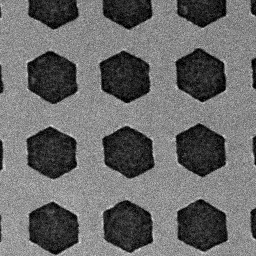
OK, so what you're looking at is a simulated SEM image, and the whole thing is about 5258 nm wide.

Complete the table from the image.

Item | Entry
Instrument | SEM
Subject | a regular array of holes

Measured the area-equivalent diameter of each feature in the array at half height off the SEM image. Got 1040 nm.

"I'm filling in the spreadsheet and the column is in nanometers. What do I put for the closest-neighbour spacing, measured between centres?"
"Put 1510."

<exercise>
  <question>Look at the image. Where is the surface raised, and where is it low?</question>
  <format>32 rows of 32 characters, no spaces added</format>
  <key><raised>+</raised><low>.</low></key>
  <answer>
++++......+++......+++......+++.
++++......+++......+++......+++.
+++++....+++++....+++++....+++++
++++++.+++++++++.+++++++++++++++
++++++++++++++++++++++++++++++++
++++++++++++++++++++++++++++++++
++++++.++++++++.++++++++..++++++
++++.....++++.....++++.....+++++
+++.......++.......+++......+++.
+++.......+++......+++......++++
+++.......+++......+++......++++
++++......+++......++++.....++++
++++++..+++++++..++++++++.++++++
++++++++++++++++++++++++++++++++
++++++++++++++++++++++++++++++++
++++++++++++++++++++++++++++++++
+++++...++++++...++++++....+++++
+++......++++......+++......++++
+++.......+++......+++......++++
+++.......+++......+++......++++
+++.......+++......++++.....++++
+++++....++++++...++++++...+++++
++++++++++++++++++++++++++++++++
++++++++++++++++++++++++++++++++
++++++++++++++++++++++++++++++++
++++++.++++++++..+++++++..++++++
++++.....++++......+++......+++.
++++......+++......+++......+++.
++++......+++......+++......+++.
++++......+++......+++.......+++
++++.....+++++.....++++.....++++
++++++..++++++++++++++++++++++++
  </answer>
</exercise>